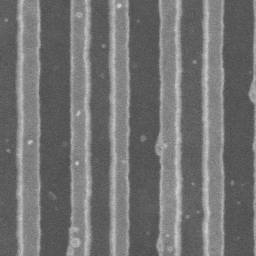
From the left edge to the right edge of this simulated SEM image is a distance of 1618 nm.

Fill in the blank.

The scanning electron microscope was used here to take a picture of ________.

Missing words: lines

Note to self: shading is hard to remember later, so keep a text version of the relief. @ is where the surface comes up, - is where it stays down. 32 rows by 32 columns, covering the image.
--@@@----@@---@@----@@----@@----
--@@@----@@---@@----@@----@@----
--@@@----@@---@@----@@----@@----
---@@----@@---@@----@@----@@----
--@@@----@@---@@----@@----@@----
--@@@----@@---@@----@@----@@----
--@@@----@@---@@----@@----@@----
--@@@----@@---@@----@@----@@----
--@@@----@@---@@----@@----@@----
--@@@----@@---@@----@@----@@----
--@@@----@@---@@----@@----@@---@
--@@@----@@---@@----@@----@@---@
--@@@----@@---@@----@@----@@---@
--@@@----@@---@@----@@----@@----
--@@@----@@---@@----@@----@@----
---@@----@@---@@----@@----@@----
--@@@----@@---@@----@@----@@----
--@@@----@@---@@----@@----@@----
--@@@----@@---@@---@@@----@@----
--@@@----@@---@@----@@----@@----
--@@@----@@---@@----@@----@@----
--@@@----@@---@@----@@----@@----
--@@@----@@---@@----@@----@@----
--@@@----@@---@@----@@----@@----
--@@@----@@---@@----@@----@@----
--@@@----@@---@@----@@----@@----
--@@@----@@---@@----@@----@@----
--@@@----@@---@@----@@----@@----
--@@@----@@---@@----@@----@@----
--@@@----@@---@@----@@----@@----
--@@@----@@---@@----@@----@@----
--@@@---@@@---@@----@@----@@----